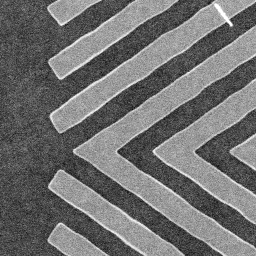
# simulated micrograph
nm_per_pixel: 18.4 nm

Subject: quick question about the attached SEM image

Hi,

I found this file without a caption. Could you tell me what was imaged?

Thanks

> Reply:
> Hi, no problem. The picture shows groups of lines, slits or small figures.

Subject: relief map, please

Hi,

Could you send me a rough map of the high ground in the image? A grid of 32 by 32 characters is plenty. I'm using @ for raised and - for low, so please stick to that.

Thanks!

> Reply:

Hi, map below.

------@@@@@@----@@@@@@----@@@@@-
------@@@@-----@@@@@-----@@@@@--
-------@@-----@@@@-----@@@@@@---
------------@@@@@-----@@@@@-----
-----------@@@@-----@@@@@@----@@
---------@@@@@-----@@@@@-----@@@
--------@@@@@-----@@@@@----@@@@@
------@@@@@-----@@@@@-----@@@@@-
------@@@@-----@@@@@----@@@@@---
-------@-----@@@@@-----@@@@@----
------------@@@@@----@@@@@-----@
----------@@@@@-----@@@@@-----@@
---------@@@@@----@@@@@@----@@@@
--------@@@@-----@@@@@-----@@@@@
------@@@@@-----@@@@@----@@@@@@-
-------@@@----@@@@@-----@@@@@---
-------------@@@@@-----@@@@@----
-----------@@@@@-----@@@@@-----@
----------@@@@@-----@@@@@----@@@
----------@@@@@-----@@@@@----@@@
------------@@@@-----@@@@@-----@
-------@-----@@@@@----@@@@@@----
-------@@@----@@@@@-----@@@@@---
------@@@@@-----@@@@@----@@@@@--
--------@@@@@----@@@@@-----@@@@@
---------@@@@@-----@@@@@----@@@@
-----------@@@@-----@@@@@-----@@
------------@@@@@----@@@@@@----@
-------@-----@@@@@-----@@@@@----
------@@@@-----@@@@@----@@@@@@--
------@@@@@@----@@@@@-----@@@@@-
--------@@@@@-----@@@@@----@@@@@